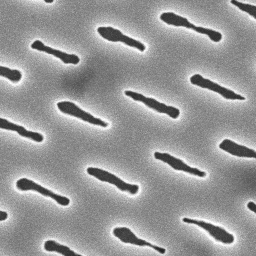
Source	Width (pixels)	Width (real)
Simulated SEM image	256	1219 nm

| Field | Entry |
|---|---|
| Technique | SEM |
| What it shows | a regular array of holes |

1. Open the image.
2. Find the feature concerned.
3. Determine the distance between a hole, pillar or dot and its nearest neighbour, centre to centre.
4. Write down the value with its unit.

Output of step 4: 0.306 microns